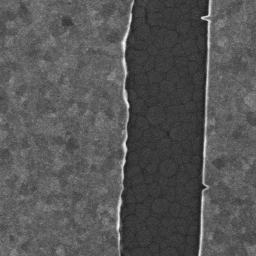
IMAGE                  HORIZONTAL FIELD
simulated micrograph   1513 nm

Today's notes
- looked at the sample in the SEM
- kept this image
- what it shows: one or a few lines or trenches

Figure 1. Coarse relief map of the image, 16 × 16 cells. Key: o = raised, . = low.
oooooooo.....ooo
oooooooo.....ooo
oooooooo.....ooo
oooooooo.....ooo
oooooooo.....ooo
oooooooo.....ooo
oooooooo.....ooo
oooooooo.....ooo
oooooooo.....ooo
oooooooo.....ooo
oooooooo.....ooo
oooooooo.....ooo
oooooooo.....ooo
ooooooo......ooo
ooooooo......ooo
ooooooo......ooo